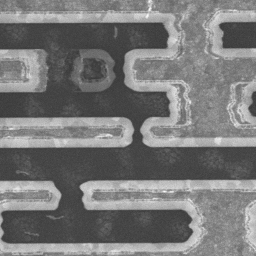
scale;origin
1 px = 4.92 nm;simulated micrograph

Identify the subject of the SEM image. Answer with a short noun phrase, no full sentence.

one or a few lines or trenches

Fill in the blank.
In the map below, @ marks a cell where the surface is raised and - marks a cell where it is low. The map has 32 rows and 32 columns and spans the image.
@@@@@@@@@@@@@@@@@@@@@@@@@@@@@@@@
@@@@@@@@@@@@@@@@@@@@@@@@@@@@@@@@
---------------------@@@@@@-----
---------------------@@@@@@-----
----------------------@@@@@-----
----------------------@@@@@-----
---------------------@@@@@@-----
@@@@------@@@---@@@@@@@@@@@@@@@@
@@@@------@@@@--@@@@@@@@@@@@@@@@
@@@@------@@@@--@@@@@@@@@@@@@@@@
@@@@------@@@----@@@@@@@@@@@@@@@
----------------------@@@@@@@@@-
----------------------@@@@@@@@@-
----------------------@@@@@@@@--
----------------------@@@@@@@@@-
@@@@@@@@@@@@@@@@---@@@@@@@@@@@@@
@@@@@@@@@@@@@@@@--@@@@@@@@@@@@@@
@@@@@@@@@@@@@@@@---@@@@@@@@@@@@@
--------------------------------
--------------------------------
--------------------------------
--------------------------------
--------------------------------
@@@@@@-----@@@@@@@@@@@@@@@@@@@@@
@@@@@@@----@@@@@@@@@@@@@@@@@@@@@
@@@@@@-----@@@@@@-----@@@@@@@@@@
------------------------@@@@@@@@
-------------------------@@@@@@@
------------------------@@@@@@@@
-------------------------@@@@@@@
------------------------@@@@@@@@
@@@@@@@@@@@@@@@@@@@@@@@@@@@@@@@@